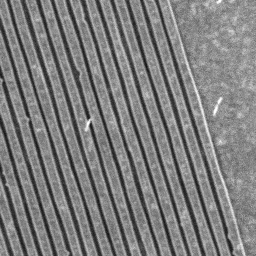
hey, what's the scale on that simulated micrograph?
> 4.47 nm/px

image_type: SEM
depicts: parallel lines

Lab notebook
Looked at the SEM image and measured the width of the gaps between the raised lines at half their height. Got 23.5 nanometers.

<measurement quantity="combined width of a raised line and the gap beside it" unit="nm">63.4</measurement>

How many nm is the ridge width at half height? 39.6